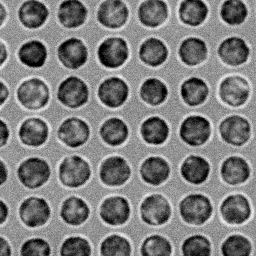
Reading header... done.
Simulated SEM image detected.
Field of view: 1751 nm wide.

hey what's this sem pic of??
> a regular array of holes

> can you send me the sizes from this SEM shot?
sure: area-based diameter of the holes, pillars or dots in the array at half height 218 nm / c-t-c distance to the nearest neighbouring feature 39.4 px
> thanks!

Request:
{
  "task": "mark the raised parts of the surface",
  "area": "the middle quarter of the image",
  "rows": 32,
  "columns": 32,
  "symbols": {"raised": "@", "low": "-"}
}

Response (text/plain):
-----@@@@-----@@@@@@@---@@@@@@@-
@@-@@@@@@@@@@@@@@@@@@@@@@@@@@@@@
@@@@@@@@@@@@@@@@@@@@@@@@@@@@@@@@
----@@@@@@@---@@@@@@@--@@@@@@@@-
-----@@@@------@@@@@-----@@@@@--
------@@@-------@@@-------@@@---
------@@--------@@@-------@@@---
------@@--------@@@-------@@@---
------@@@-------@@@-------@@@---
------@@@------@@@@@-----@@@@@--
-----@@@@@----@@@@@@@@-@@@@@@@@-
@@@@@@@@@@@@@@@@@@@@@@@@@@@@@@@@
@@@@@@@@@@@@@@@@@@@@@@@@@@@@@@@@
@---@@@@@@@---@@@@@@@---@@@@@@--
-----@@@@@-----@@@@@-----@@@@---
------@@@-------@@@-------@@@---
------@@@-------@@@-------@@@---
-------@@-------@@@-------@@@---
------@@@-------@@@@------@@@---
------@@@@-----@@@@@-----@@@@@--
@---@@@@@@@@--@@@@@@@@@@@@@@@@@@
@@@@@@@@@@@@@@@@@@@@@@@@@@@@@@@@
@@@@@@@@@@@@@@@@@@@@@@@@@@@@@@@@
-----@@@@@-----@@@@@@----@@@@@--
------@@@-------@@@@------@@@@--
-------@@-------@@@--------@@---
-------@@--------@@--------@@---
-------@@--------@@--------@@---
-------@@-------@@@-------@@@@--
------@@@-------@@@@-----@@@@@@-
-----@@@@@----@@@@@@@@@@@@@@@@@@
@@@@@@@@@@@@@@@@@@@@@@@@@@@@@@@@